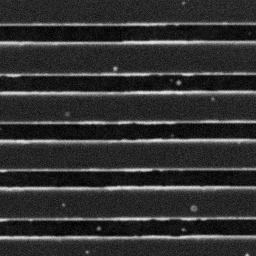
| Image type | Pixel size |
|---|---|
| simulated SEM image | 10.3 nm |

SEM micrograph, lines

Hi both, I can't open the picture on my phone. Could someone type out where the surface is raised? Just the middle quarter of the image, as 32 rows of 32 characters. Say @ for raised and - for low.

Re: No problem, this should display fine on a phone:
@@@@@@@@@@@@@@@@@@@@@@@@@@@@@@@@
@@@@@@@@@@@@@@@@@@@@@@@@@@@@@@@@
@@@@@@@@@@@@@@@@@@@@@---------@@
--------------------------------
--------------------------------
--------------------------------
--------------------------------
@@@@@@@@@@@@@@@@@@@@@@@@@@@@@@@@
@@@@@@@@@@@@@@@@@@@@@@@@@@@@@@@@
@@@@@@@@@@@@@@@@@@@@@@@@@@@@@@@@
@@@@@@@@@@@@@@@@@@@@@@@@@@@@@@@@
@@@@@@@@@@@@@@@@@@@@@@@@@@@@@@@@
@@@@@@@@@@@@@@@@@@@@@@@@@@@@@@@@
@@@@@@@@@@@@@@@@@@@@@@@@@@@@@@@@
@@@@@@@@@@@@@@@@@@@@@@@@@@@@@@@@
--------------------------------
--------------------------------
--------------------------------
--------------------------------
@@@@@@@@@@@@@@@@@@@@@@@@@@@@@@@@
@@@@@@@@@@@@@@@@@@@@@@@@@@@@@@@@
@@@@@@@@@@@@@@@@@@@@@@@@@@@@@@@@
@@@@@@@@@@@@@@@@@@@@@@@@@@@@@@@@
@@@@@@@@@@@@@@@@@@@@@@@@@@@@@@@@
@@@@@@@@@@@@@@@@@@@@@@@@@@@@@@@@
@@@@@@@@@@@@@@@@@@@@@@@@@@@@@@@@
@@@@@@@@@@@@@@@@@@@@@-----------
--------------------------------
--------------------------------
--------------------------------
--------------------------------
@@@@@@@@@@@@@@@@@@@@@@@@@@@@@@@@